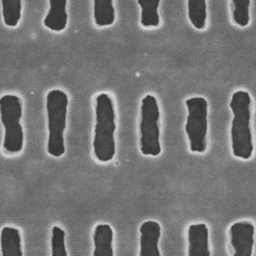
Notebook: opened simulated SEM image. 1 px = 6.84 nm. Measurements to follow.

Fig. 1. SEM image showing holes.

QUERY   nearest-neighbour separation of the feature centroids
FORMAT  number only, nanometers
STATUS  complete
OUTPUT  309